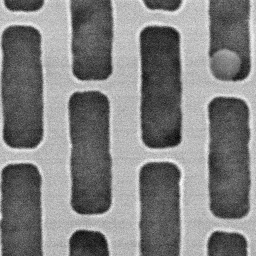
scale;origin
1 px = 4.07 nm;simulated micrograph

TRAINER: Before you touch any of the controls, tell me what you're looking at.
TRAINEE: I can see holes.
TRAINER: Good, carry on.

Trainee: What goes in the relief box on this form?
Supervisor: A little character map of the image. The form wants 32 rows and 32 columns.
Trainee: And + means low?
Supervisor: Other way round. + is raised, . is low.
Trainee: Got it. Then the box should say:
+....++++.....++++.....+++.....+
+++++++++.....++++++++++++.....+
+++++++++.....++++++++++++.....+
+...+++++.....++++....++++.....+
.....++++.....+++......+++.....+
.....++++.....+++......+++.....+
.....++++.....+++......+++.....+
.....++++.....++++.....+++.....+
.....++++.....++++.....+++.....+
.....++++.....++++.....++++....+
.....+++++++++++++.....+++++++++
.....++++....+++++.....+++++++++
.....++++.....++++.....+++....++
......+++.....++++.....+++.....+
......+++.....++++.....+++.....+
......+++.....++++.....+++.....+
.....++++.....++++.....+++.....+
.....++++.....++++.....+++.....+
+...+++++.....++++...+++++.....+
+++++++++.....++++++++++++.....+
+...+++++.....++++....++++.....+
.....++++.....+++......+++.....+
.....++++.....+++......+++.....+
.....++++.....+++.....++++.....+
.....++++.....+++......+++.....+
.....++++.....+++......+++.....+
.....++++....++++......+++.....+
.....++++++++++++......++++++.++
.....++++++++++++......+++++++++
.....++++....++++......+++.....+
.....++++....++++......+++.....+
.....++++.....+++......+++.....+